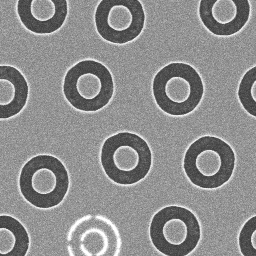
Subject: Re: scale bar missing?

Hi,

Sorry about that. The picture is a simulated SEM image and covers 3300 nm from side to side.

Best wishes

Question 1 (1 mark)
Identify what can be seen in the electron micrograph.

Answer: ring-shaped grooves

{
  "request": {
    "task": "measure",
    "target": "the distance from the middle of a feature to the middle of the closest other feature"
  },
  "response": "1050 nanometres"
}